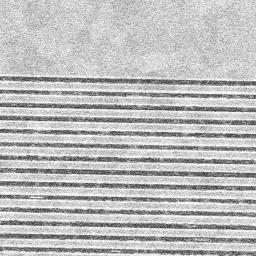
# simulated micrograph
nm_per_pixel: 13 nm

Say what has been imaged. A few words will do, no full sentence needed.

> parallel lines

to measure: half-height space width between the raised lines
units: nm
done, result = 76.3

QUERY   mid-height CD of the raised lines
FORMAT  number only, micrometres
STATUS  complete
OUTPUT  0.0909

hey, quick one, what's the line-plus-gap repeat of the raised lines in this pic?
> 170 nm